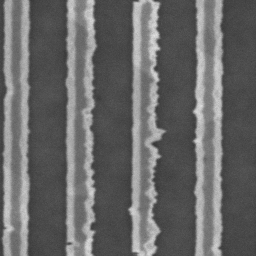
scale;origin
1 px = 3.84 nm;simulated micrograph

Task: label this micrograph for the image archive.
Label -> one or a few lines or trenches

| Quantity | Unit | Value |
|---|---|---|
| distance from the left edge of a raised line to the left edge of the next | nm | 246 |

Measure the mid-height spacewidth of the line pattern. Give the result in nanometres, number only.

174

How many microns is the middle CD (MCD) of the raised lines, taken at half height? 0.073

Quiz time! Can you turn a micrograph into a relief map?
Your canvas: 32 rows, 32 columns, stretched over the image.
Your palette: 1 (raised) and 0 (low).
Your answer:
01100000011000000110000001100000
01100000011000000110000001100000
01100000011000000111000001100000
01100000011000000110000001100000
01100000011000000110000001100000
01100000011100000110000001100000
01100000011000000110000001100000
01100000011000000111000001100000
01100000011000000110000001100000
01100000011000000110000001100000
01100000011000000111000001100000
01100000011000000110000001100000
01100000011100000110000001100000
01100000011000000110000001100000
01100000011000000110000001100000
01100000011000000110000001100000
01100000011000000111000001100000
01100000011000000110000001100000
01100000011000000110000001100000
01100000011000000110000001100000
01100000011000000110000001100000
01100000011000000110000001100000
01100000011000000110000001100000
01100000011000000110000001100000
01100000011100000110000001100000
01100000011000000110000001100000
01100000011000000110000001100000
01100000011000000110000001100000
01100000011000000110000001100000
01100000011000000110000001100000
01100000011000000110000001100000
01100000011000000110000001100000